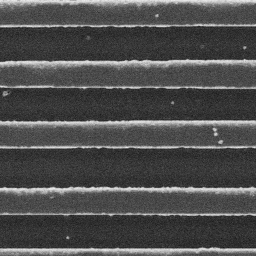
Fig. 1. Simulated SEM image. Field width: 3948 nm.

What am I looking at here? lines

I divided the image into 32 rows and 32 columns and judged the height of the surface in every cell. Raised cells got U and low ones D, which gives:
UUUUUUUUUUUUUUUUUUUUUUUUUUUUUUUU
UUUUUUUUUUUUUUUUUUUUUUUUUUUUUUUU
UUUUUUUUUUUUUUUUUUUUUUUUUUUUUUUU
DDDDDDDDDDDDDDDDDDDDDDDDDDDDDDDD
DDDDDDDDDDDDDDDDDDDDDDDDDDDDDDDD
DDDDDDDDDDDDDDDDDDDDDDDDDDDDDDDD
DDDDDDDDDDDDDDDDDDDDDDDDDDDDDDDD
DDDDDDDDDDDDDDDDDDDDDDDDDDDDDDDD
UUUUUUUUUUUUUUUUUUUUUUUUUUUUUUUU
UUUUUUUUUUUUUUUUUUUUUUUUUUUUUUUU
UUUUUUUUUUUUUUUUUUUUUUUUUUUUUUUU
DDDDDDDDDDDDDDDDDDDDDDDDDDDDDDDD
DDDDDDDDDDDDDDDDDDDDDDDDDDDDDDDD
DDDDDDDDDDDDDDDDDDDDDDDDDDDDDDDD
DDDDDDDDDDDDDDDDDDDDDDDDDDDDDDDD
UUUUUUUUUUUUUUUUUUUUUUUUUUUUUUUU
UUUUUUUUUUUUUUUUUUUUUUUUUUUUUUUU
UUUUUUUUUUUUUUUUUUUUUUUUUUUUUUUU
DDDDDDDDDDDDDDDDDDDDDDDDDDDDDDDD
DDDDDDDDDDDDDDDDDDDDDDDDDDDDDDDD
DDDDDDDDDDDDDDDDDDDDDDDDDDDDDDDD
DDDDDDDDDDDDDDDDDDDDDDDDDDDDDDDD
DDDDDDDDDDDDDDDDDDDDDDDDDDDDDDDD
DDDDDDDDDDDDDUDDDDDDDDDDDDDDDDDD
UUUUUUUUUUUUUUUUUUUUUUUUUUUUUUUU
UUUUUUUUUUUUUUUUUUUUUUUUUUUUUUUU
UUUUUUUUUUUUUUUUUUUUUUUUUUUUUUUU
DDDDDDDDDDDDDDDDDDDDDDDDDDDDDDDD
DDDDDDDDDDDDDDDDDDDDDDDDDDDDDDDD
DDDDDDDDDDDDDDDDDDDDDDDDDDDDDDDD
DDDDDDDDDDDDDDDDDDDDDDDDDDDDDDDD
UUUUUUUUUUUUUUUUUUUUUUUUUUUUUUUU